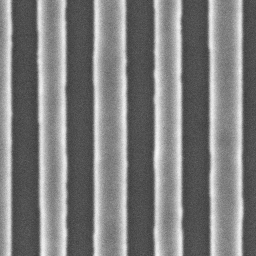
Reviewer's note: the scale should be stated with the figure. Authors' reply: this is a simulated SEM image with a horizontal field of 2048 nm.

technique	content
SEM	lines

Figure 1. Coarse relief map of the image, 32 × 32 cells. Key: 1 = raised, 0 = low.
10000111000011110001111000111100
10000111000011110001111000111100
10000111000011110001110000111100
10000111000011110001110000111100
10000111000011110001111000111100
10000111000011110001111000111100
10000111000011110001111000111100
10000111000011110001111000111100
10000111000011110001111000111100
10000111000011110001110000111100
10000111000011110001111000111100
10000111000011110001111000111100
10000111000011110001111000111100
10000111000011110001111000111100
10000111000011110001111000111100
10000111000011110001111000111100
10000111000011110001111000111100
10000111000011110001111000111100
10000111000011110001111000111100
10000111000011110001111000111100
10000111000011110001111000111100
10000111000011110001111000111100
10000111000011110001111000111100
10000111000011110001111000111100
10000111000011110001111000111100
10000111000011110001111000111100
10000111000011110001111000111100
10000111000011110001111000111100
10000111000011110001111000111100
10000111000011110001111000111100
10000111000011110001111000111100
10000111000011110001111000111100